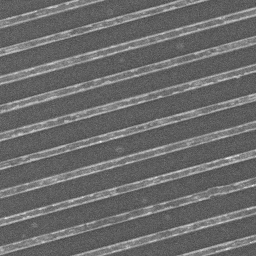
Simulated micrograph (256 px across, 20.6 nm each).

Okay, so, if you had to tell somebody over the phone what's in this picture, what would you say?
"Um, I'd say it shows parallel lines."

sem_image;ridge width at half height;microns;0.141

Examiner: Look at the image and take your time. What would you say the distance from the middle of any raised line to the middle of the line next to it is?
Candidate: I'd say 562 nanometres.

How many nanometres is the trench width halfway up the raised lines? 407